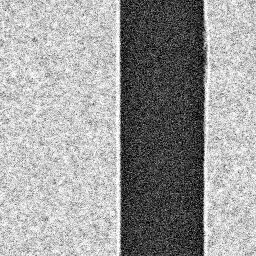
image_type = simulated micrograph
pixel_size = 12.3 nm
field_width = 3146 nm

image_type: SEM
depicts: one or a few lines or trenches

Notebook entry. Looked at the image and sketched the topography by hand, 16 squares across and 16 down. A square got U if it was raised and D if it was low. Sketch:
UUUUUUUDDDDDDUUU
UUUUUUUDDDDDDUUU
UUUUUUUDDDDDDUUU
UUUUUUUDDDDDDUUU
UUUUUUUDDDDDDUUU
UUUUUUUDDDDDDUUU
UUUUUUUDDDDDDUUU
UUUUUUUDDDDDDUUU
UUUUUUUDDDDDDUUU
UUUUUUUDDDDDDUUU
UUUUUUUDDDDDDUUU
UUUUUUUDDDDDDUUU
UUUUUUUDDDDDDUUU
UUUUUUUDDDDDDUUU
UUUUUUUDDDDDDUUU
UUUUUUUDDDDDDUUU